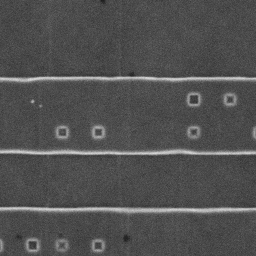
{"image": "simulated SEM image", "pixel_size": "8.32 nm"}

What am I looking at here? wiring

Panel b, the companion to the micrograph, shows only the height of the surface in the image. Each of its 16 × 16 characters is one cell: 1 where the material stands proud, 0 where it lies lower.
0000000000000000
0000000000000000
0000000000000000
0000000000000000
0000000000000000
1111111111111111
1111111111111111
1111111111111111
1111111111111111
1111111111111111
0000000000000000
0000000000000000
0000000000000000
1111111111111111
1111111111111111
1111111111111111